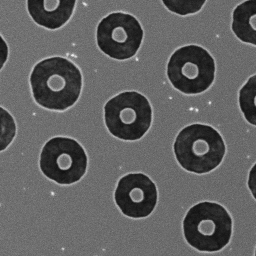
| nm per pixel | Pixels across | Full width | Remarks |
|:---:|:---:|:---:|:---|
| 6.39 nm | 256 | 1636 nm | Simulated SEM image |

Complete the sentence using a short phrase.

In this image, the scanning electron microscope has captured a regular array of ring-shaped grooves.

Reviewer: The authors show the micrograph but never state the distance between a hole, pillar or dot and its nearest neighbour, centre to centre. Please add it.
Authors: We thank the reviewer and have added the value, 499 nm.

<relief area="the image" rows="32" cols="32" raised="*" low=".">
***...*..************....*****..
****.....*************..*****...
****....*****....************..*
******.*****......***********...
************..**..************..
.***********......**************
.************....*****....******
.*****..*************......*****
****......***********..**..*****
****......***********..**..*****
****..**..************....*****.
****......******.******..*****..
****......****....************..
******..*****......***********..
.************..**..************.
..***********......*****.******.
..************....*****....*****
..****...*************......****
.****.....************..**..****
*****...*..***********......****
*****..**..************....*****
*****......*************..*****.
*******...*****....************.
***************.....***********.
**************..**..************
***************....******..*****
***************....****.....****
***********************......***
***********************..**..***
***********************......***
************************....****
********************************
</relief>